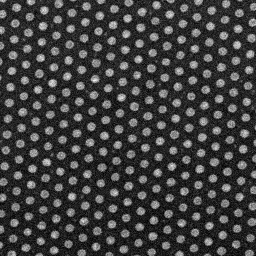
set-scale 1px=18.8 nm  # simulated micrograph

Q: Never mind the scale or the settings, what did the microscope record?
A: a regular array of raised bodies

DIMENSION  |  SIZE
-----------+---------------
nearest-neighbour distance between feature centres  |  296 nanometres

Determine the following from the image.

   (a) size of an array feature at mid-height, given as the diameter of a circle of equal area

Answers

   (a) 145 nanometres